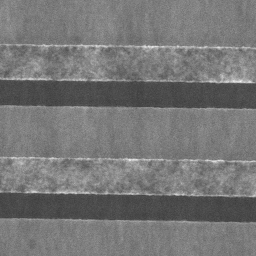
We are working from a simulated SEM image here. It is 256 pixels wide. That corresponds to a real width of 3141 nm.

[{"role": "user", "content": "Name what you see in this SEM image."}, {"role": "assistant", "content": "lines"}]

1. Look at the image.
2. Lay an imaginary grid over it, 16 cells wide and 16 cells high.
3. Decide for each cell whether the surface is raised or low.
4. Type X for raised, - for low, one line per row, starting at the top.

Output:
XXXXXXXXXXXXXXXX
XXXXXXXXXXXXXXXX
XXXXXXXXXXXXXXXX
XXXXXXXXXXXXXXXX
XXXXXXXXXXXXXXXX
----------------
----------------
XXXXXXXXXXXXXXXX
XXXXXXXXXXXXXXXX
XXXXXXXXXXXXXXXX
XXXXXXXXXXXXXXXX
XXXXXXXXXXXXXXXX
----------------
----------------
XXXXXXXXXXXXXXXX
XXXXXXXXXXXXXXXX